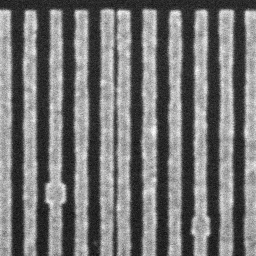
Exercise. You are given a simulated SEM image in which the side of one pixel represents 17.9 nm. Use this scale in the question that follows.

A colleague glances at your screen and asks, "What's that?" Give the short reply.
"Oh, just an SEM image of wiring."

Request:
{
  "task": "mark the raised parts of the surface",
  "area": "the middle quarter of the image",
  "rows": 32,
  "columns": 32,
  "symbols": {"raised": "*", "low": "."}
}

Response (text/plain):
...**.....**..**....***....**...
...**.....**..**....***....**...
...**.....**..**....***....**...
...**.....**..**....***....**...
...**.....**..**....***....**...
...**.....**..**....***....**...
...**.....**..**....***....**...
...***....**..**....***....**...
...***....**..**....***....**...
...***....**..**....***....**...
...***....**..**....***....**...
...***....**..**....***....**...
...***....**..**....***....**...
...***....**..**....***....**...
...***....**..**....***....**...
...***....**..**....***....**...
...***....**..**....***....**...
...***....**..**....***....**...
...***....**..**....***....**...
...***....**..**....***....**...
...**.....**..**....***....**...
...**.....**..**....***....**...
...**.....**..**....***....**...
...**.....**..**....***....**...
...**....***..**....***...***...
...**....***..**....***...***...
...**....***..**....***...***...
...**.....**..**....***...***...
...**.....**..**....***...***...
...***...***..**....***...***...
...***...***..**....***...***...
...***...***..**....***...***...